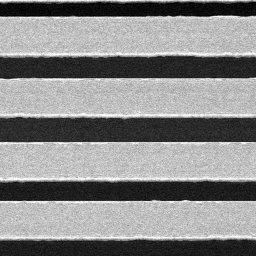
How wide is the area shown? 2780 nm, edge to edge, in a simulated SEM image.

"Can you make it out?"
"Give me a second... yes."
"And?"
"lines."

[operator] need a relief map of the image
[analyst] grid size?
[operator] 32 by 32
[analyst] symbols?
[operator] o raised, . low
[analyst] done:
................................
................................
oooooooooooooooooooooooooooooooo
oooooooooooooooooooooooooooooooo
oooooooooooooooooooooooooooooooo
oooooooooooooooooooooooooooooooo
oooooooooooooooooooooooooooooooo
................................
................................
................................
oooooooooooooooooooooooooooooooo
oooooooooooooooooooooooooooooooo
oooooooooooooooooooooooooooooooo
oooooooooooooooooooooooooooooooo
oooooooooooooooooooooooooooooooo
................................
................................
................................
oooooooooooooooooooooooooooooooo
oooooooooooooooooooooooooooooooo
oooooooooooooooooooooooooooooooo
oooooooooooooooooooooooooooooooo
oooooooooooooooooooooooooooooooo
................................
................................
oooooooooooooooooooooooooooooooo
oooooooooooooooooooooooooooooooo
oooooooooooooooooooooooooooooooo
oooooooooooooooooooooooooooooooo
oooooooooooooooooooooooooooooooo
................................
................................